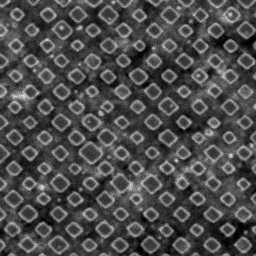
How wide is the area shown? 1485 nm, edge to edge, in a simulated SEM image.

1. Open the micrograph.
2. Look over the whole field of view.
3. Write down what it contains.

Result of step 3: a regular array of raised bodies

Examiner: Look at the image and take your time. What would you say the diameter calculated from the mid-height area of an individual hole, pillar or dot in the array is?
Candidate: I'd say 76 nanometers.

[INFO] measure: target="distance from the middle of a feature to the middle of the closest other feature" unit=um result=0.124